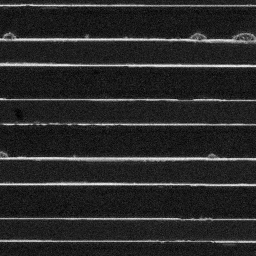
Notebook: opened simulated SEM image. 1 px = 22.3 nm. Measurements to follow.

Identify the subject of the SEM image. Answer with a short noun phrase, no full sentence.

lines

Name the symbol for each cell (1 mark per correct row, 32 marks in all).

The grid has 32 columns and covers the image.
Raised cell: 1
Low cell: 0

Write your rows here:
11111111111111111111111111111111
00000000000000000000000000000000
00000000000000000000000000000000
00000000000000000000000000000000
00000000000000000000000000000000
11111111111111111111111111111111
11111111111111111111111111111111
11111111111111111111111111111111
00000000000000000000000000000000
00000000000000000000000000000000
00000000000000000000000000000000
00000000000000000000000000000000
11111111111111111111110011110000
11111111111111111111111111111111
11111111111111111111111111111111
11110000011111111111111111111111
00000000000000000000000000000000
00000000000000000000000000000000
00000000000000000000000000000000
00000000000000000000000000000000
11111111111111111111111111111111
11111111111111111111111111111111
11111111111111111111111111111111
00000000000000000000000000000000
00000000000000000000000000000000
00000000000000000000000000000000
00000000000000000000000000000000
11111111111111111111111111111111
11111111111111111111111111111111
11111111111111111111111111111111
00000000000000000000000000000000
00000000000000000000000000000000